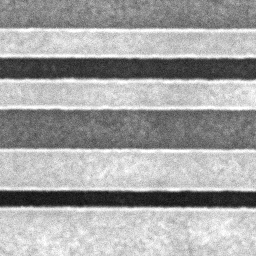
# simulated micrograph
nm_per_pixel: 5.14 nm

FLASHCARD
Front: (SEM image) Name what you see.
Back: lines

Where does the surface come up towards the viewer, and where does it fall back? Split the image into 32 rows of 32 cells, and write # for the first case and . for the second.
................................
................................
................................
................................
################################
################################
################################
................................
................................
................................
################################
################################
################################
################################
................................
................................
................................
................................
................................
################################
################################
################################
################################
################################
................................
................................
################################
################################
################################
################################
################################
################################